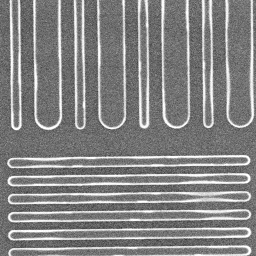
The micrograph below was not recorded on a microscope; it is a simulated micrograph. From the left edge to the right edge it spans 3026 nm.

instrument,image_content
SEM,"groups of lines, slits or small figures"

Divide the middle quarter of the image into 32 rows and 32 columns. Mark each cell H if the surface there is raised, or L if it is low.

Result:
LLLHHLLLLHHHHHHLLLLHHLLLLHHHHHHL
LLLHHLLLLHHHHHHLLLLHHLLLLHHHHHHL
LLLHHLLLLHHHHHHLLLLHHLLLLHHHHHHL
LLLHHLLLLHHHHHHLLLLHHLLLLHHHHHHL
LLLHHLLLLHHHHHHLLLLHHLLLLHHHHHHL
LLLHHLLLLHHHHHHLLLLHHLLLLHHHHHHL
LLLHHLLLLHHHHHHLLLLHHLLLLHHHHHHL
LLLHHLLLLHHHHHHLLLLHHLLLLHHHHHHL
LLLHHLLLLHHHHHHLLLLHHLLLLHHHHHHL
LLLHHLLLLHHHHHHLLLLHHLLLLHHHHHHL
LLLHHLLLLHHHHHHLLLLHHLLLLHHHHHHL
LLLHHLLLLHHHHHHLLLLHHLLLLHHHHHHL
LLLHHLLLLHHHHHHLLLLHHLLLLHHHHHHL
LLLHHLLLLHHHHHHLLLLHHLLLLHHHHHHL
LLLHHLLLLHHHHHHLLLLHHLLLLLHHHHHL
LLLHHLLLLLHHHHLLLLLLHLLLLLLHHHLL
LLLLLLLLLLLLLLLLLLLLLLLLLLLLLLLL
LLLLLLLLLLLLLLLLLLLLLLLLLLLLLLLL
LLLLLLLLLLLLLLLLLLLLLLLLLLLLLLLL
LLLLLLLLLLLLLLLLLLLLLLLLLLLLLLLL
LLLLLLLLLLLLLLLLLLLLLLLLLLLLLLLL
LLLLLLLLLLLLLLLLLLLLLLLLLLLLLLLL
LLLLLLLLLLLLLLLLLLLLLLLLLLLLLLLL
LHHHHHHHHHHHHHHHHHHHHHHHHHHHHHHH
HHHHHHHHHHHHHHHHHHHHHHHHHHHHHHHH
HHHHHHHHHHHHHHLLLLLLLLLLLLLLLLLL
LLLLLLLLLLLLLLLLLLLLLLLLLLLLLLLL
LLLLLLLLLLLLLLLLLLLLLLLLLLLLLLLL
HHHHHHHHHHHHHHHHHHHHHHHHHHHHHHHH
HHHHHHHHHHHHHHHHHHHHHHHHHHHHHHHH
LLLLLLLLLLLLLLLLLLLLLLLLLLLLLLLL
LLLLLLLLLLLLLLLLLLLLLLLLLLLLLLLL